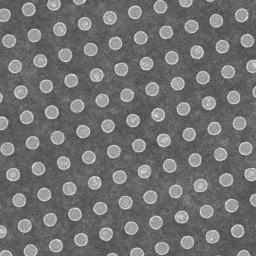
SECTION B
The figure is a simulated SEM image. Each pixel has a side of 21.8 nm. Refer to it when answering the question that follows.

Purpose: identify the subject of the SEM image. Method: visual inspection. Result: a regular array of raised bodies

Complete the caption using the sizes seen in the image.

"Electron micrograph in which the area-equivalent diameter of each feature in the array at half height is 0.286 micrometres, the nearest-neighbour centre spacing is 560 nanometers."